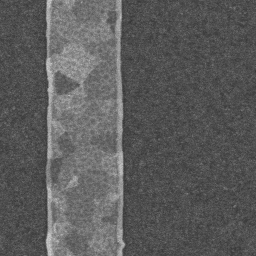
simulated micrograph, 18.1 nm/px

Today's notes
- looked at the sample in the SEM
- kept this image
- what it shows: one or a few lines or trenches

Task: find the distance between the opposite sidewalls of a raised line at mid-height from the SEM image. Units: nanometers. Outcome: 1290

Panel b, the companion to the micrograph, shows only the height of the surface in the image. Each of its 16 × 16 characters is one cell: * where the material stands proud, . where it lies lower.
...****.........
...****.........
...****.........
...****.........
...****.........
...****.........
...****.........
...*****........
...*****........
...*****........
...*****........
...*****........
...*****........
...*****........
...*****........
...*****........